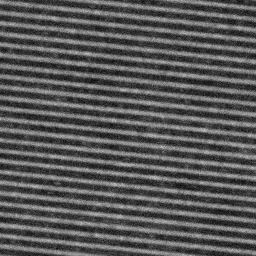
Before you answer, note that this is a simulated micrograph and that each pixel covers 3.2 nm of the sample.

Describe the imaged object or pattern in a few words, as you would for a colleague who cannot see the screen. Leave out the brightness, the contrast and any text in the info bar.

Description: parallel lines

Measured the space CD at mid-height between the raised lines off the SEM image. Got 23 nm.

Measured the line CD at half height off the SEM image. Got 8.7 nanometres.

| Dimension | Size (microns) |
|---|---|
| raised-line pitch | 0.0337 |